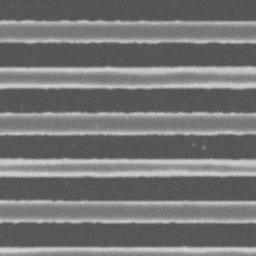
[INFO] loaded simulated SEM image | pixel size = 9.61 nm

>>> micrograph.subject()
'lines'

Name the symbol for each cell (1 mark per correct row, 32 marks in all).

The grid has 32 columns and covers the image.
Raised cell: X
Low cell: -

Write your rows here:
--------------------------------
--------------------------------
--------------------------------
XXXXXXXXXXXXXXXXXXXXXXXXXXXXXXXX
XXXXXXXXXXXXXXXXXXXXXXXXXXXXXXXX
--------------------------------
--------------------------------
--------------------------------
--------------------------------
XXXXXXXXXXXXXXXXXXXXXXXXXXXXXXXX
XXXXXXXXXXXXXXXXXXXXXXXXXXXXXXXX
--------------------------------
--------------------------------
--------------------------------
XXXXXXXXXXXXXXXXXXXXXXXXXXXXXXXX
XXXXXXXXXXXXXXXXXXXXXXXXXXXXXXXX
XXXXXXXXXXXXXXXXXXXXXXXXXXXXXXXX
--------------------------------
--------------------------------
--------------------------------
XXXXXXXXXXXXXXXXXXXXXXXXXXXXXXXX
XXXXXXXXXXXXXXXXXXXXXXXXXXXXXXXX
--------------------------------
--------------------------------
--------------------------------
XXXXXXXXXXXXXXXXXXXXXXXXXXXXXXXX
XXXXXXXXXXXXXXXXXXXXXXXXXXXXXXXX
XXXXXXXXXXXXXXXXXXXXXXXXXXXXXXXX
--------------------------------
--------------------------------
--------------------------------
XXXXXXXXXXXXXXXXXXXXXXXXXXXXXXXX